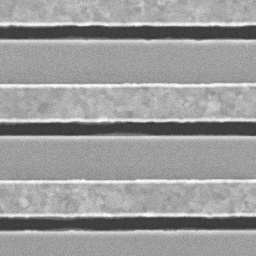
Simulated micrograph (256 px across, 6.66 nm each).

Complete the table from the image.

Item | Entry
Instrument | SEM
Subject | lines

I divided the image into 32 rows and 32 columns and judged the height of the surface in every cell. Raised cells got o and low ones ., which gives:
oooooooooooooooooooooooooooooooo
oooooooooooooooooooooooooooooooo
oooooooooooooooooooooooooooooooo
................................
................................
oooooooooooooooooooooooooooooooo
oooooooooooooooooooooooooooooooo
oooooooooooooooooooooooooooooooo
oooooooooooooooooooooooooooooooo
oooooooooooooooooooooooooooooooo
oooooooooooooooooooooooooooooooo
oooooooooooooooooooooooooooooooo
oooooooooooooooooooooooooooooooo
oooooooooooooooooooooooooooooooo
oooooooooooooooooooooooooooooooo
................................
................................
oooooooooooooooooooooooooooooooo
oooooooooooooooooooooooooooooooo
oooooooooooooooooooooooooooooooo
oooooooooooooooooooooooooooooooo
oooooooooooooooooooooooooooooooo
oooooooooooooooooooooooooooooooo
oooooooooooooooooooooooooooooooo
oooooooooooooooooooooooooooooooo
oooooooooooooooooooooooooooooooo
oooooooooooooooooooooooooooooooo
................................
................................
oooooooooooooooooooooooooooooooo
oooooooooooooooooooooooooooooooo
oooooooooooooooooooooooooooooooo